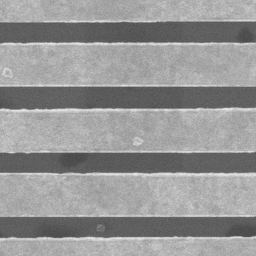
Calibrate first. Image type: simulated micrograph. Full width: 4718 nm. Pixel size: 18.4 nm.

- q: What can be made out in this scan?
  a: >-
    lines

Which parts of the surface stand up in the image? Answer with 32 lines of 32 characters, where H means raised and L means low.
HHHHHHHHHHHHHHHHHHHHHHHHHHHHHHHH
HHHHHHHHHHHHHHHHHHHHHHHHHHHHHHHH
HHHHHHHHHHHHHHHHHHHHHHHHHHHHHHHH
LLLLLLLLLLLLLLLLLLLLLLLLLLLLLLLL
LLLLLLLLLLLLLLLLLLLLLLLLLLLLLLLL
HLLHHHHHHHHHHHHHHHHLHHHHHHHHHHHH
HHHHHHHHHHHHHHHHHHHHHHHHHHHHHHHH
HHHHHHHHHHHHHHHHHHHHHHHHHHHHHHHH
HHHHHHHHHHHHHHHHHHHHHHHHHHHHHHHH
HHHHHHHHHHHHHHHHHHHHHHHHHHHHHHHH
HHHHHHHHHHHHHHHHHHHHHHHHHHHHHHHH
LLLLLLLLLLLLLLLLLLLLLLLLLLLLLLLL
LLLLLLLLLLLLLLLLLLLLLLLLLLLLLLLL
LLLLLLLLLLLLLLLLLLLLLLLLLLLLLLLL
HHHHHHHHHHHHHHHHHHHHHHHHHHHHHHHH
HHHHHHHHHHHHHHHHHHHHHHHHHHHHHHHH
HHHHHHHHHHHHHHHHHHHHHHHHHHHHHHHH
HHHHHHHHHHHHHHHHHHHHHHHHHHHHHHHH
HHHHHHHHHHHHHHHHHHHHHHHHHHHHHHHH
LLLLLLLLLLLLLLLLLLLLLLLLLLLLLLLL
LLLLLLLLLLLLLLLLLLLLLLLLLLLLLLLL
LLLLLLLLLLLLLLLLLLLLLLLLLLLLLLLL
HHHHHHHHHHHHHHHHHHHHHHHHHHHHHHHH
HHHHHHHHHHHHHHHHHHHHHHHHHHHHHHHH
HHHHHHHHHHHHHHHHHHHHHHHHHHHHHHHH
HHHHHHHHHHHHHHHHHHHHHHHHHHHHHHHH
HHHHHHHHHHHHHHHHHHHHHHHHHHHHHHHH
LLLLLLLLLLLLLLLLLLLLLLLLLLLLLLLL
LLLLLLLLLLLLLLLLLLLLLLLLLLLLLLLL
LLLLLLLLLLLLLLLLLLLLLLLLLLLLLLLL
HHHHHHHHHHHHHHHHHHHHHHHHHHHHHHHH
HHHHHHHHHHHHHHHHHHHHHHHHHHHHHHHH